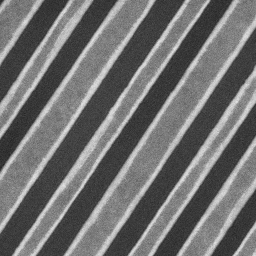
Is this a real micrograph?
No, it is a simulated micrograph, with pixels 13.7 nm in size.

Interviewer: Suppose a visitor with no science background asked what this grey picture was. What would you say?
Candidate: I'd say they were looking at lines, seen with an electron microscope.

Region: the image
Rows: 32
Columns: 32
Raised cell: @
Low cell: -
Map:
@@@@@---@@@---@@@@@----@@@---@@@
@@@@----@@@---@@@@----@@@---@@@@
@@@@---@@@---@@@@@----@@@---@@@@
@@@---@@@---@@@@@----@@@---@@@@@
@@----@@----@@@@----@@@---@@@@@-
@@---@@@---@@@@@----@@@---@@@@--
@---@@@---@@@@@----@@@---@@@@@--
----@@@---@@@@----@@@---@@@@@---
---@@@---@@@@@---@@@----@@@@----
--@@@---@@@@@----@@@---@@@@@---@
--@@@---@@@@----@@@---@@@@@----@
-@@@---@@@@@---@@@----@@@@----@@
@@@---@@@@@----@@@---@@@@@---@@@
@@@---@@@@----@@@---@@@@@---@@@-
@@---@@@@@---@@@----@@@@----@@@-
@---@@@@@----@@@---@@@@@---@@@--
@---@@@@----@@@---@@@@@---@@@---
---@@@@@---@@@----@@@@----@@@---
--@@@@@----@@@---@@@@@---@@@---@
-@@@@@----@@@---@@@@@----@@---@@
-@@@@@---@@@----@@@@----@@@---@@
@@@@@----@@@---@@@@@---@@@---@@@
@@@@----@@@---@@@@@---@@@---@@@@
@@@@---@@@----@@@@----@@@---@@@@
@@@----@@@---@@@@@---@@@---@@@@-
@@----@@@---@@@@@---@@@---@@@@--
@@---@@@----@@@@----@@@---@@@@--
@----@@@---@@@@@---@@@---@@@@---
----@@@---@@@@@---@@@---@@@@---@
---@@@----@@@@----@@@---@@@@---@
---@@----@@@@@---@@@---@@@@---@@
--@@@---@@@@@---@@@---@@@@@---@@